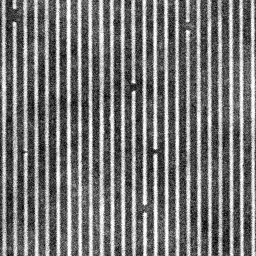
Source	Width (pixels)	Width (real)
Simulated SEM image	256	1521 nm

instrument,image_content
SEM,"parallel lines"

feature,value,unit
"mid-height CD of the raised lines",17.1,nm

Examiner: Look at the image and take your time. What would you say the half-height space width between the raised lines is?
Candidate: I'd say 46.8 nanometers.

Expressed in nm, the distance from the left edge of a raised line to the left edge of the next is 64.2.